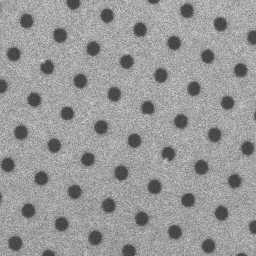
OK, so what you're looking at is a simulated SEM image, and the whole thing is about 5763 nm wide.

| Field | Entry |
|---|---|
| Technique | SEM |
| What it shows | a regular array of holes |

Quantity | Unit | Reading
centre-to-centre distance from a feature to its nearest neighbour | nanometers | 783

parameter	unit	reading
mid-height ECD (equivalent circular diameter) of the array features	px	14.4